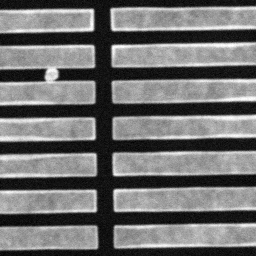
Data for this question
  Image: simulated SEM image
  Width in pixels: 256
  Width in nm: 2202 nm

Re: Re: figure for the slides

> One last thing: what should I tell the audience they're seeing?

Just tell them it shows groups of lines, slits or small figures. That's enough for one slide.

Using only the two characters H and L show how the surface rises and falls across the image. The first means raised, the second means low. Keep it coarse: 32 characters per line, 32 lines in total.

LLLLLLLLLLLLLLLLLLLLLLLLLLLLLLLL
HHLHHHHHHHHLLLHHHHHHHHHHHHHHHHHH
HHHHHHHHHHHLLLHHHHHHHHHHHHHHHHHH
HHHHHHHHHHHLLLHHHHHHHHHHHHHHLLLL
LLLLLLLLLLLLLLLLLLLLLLLLLLLLLLLL
LLLLLLLLLLLLLLLLLLLLLLLLLLLLLLLL
HHHHHHHHHHHHLLHHHHHHHHHHHHHHHHHH
HHHHHHHHHHHHLLHHHHHHHHHHHHHHHHHH
HHLLLLHLLLLLLLLLLLLLLLLLLLLLLLLL
LLLLLLHLLLLLLLLLLLLLLLLLLLLLLLLL
HHHHHHHHHHHHLLHHHHHHHHHHHHHHHHHH
HHHHHHHHHHHHLLHHHHHHHHHHHHHHHHHH
HHHHHHHHHHHHLLHHHHHHHHHHHHHHLLLL
LLLLLLLLLLLLLLLLLLLLLLLLLLLLLLLL
LLLLLLLLLLLLLLLLLLLLLLLLLLLLLLLL
HHHHHHHHHHHHLLHHHHHHHHHHHHHHHHHH
HHHHHHHHHHHHLLHHHHHHHHHHHHHHHHHH
LLLLLLLLLLLLLLLLLLLLLLLLLLLLLLLL
LLLLLLLLLLLLLLLLLLLLLLLLLLLLLLLL
LLLLLLHHHHHHLLHHHHHHHHHHHHHHHHHH
HHHHHHHHHHHHLLHHHHHHHHHHHHHHHHHH
HHHHHHHHHHHHLLHHHHHHHHHHHHHHHHHH
LLLLLLLLLLLLLLLLLLLLLLLLLLLLLLLL
LLLLLLLLLLLLLLLLLLLLLLLLLLLLLLLL
HHHHHHHHHHHHLLHHHHHHHHHHHHHHHHHH
HHHHHHHHHHHHLLHHHHHHHHHHHHHHHHHH
HHHHHHLLLLLLLLLLLLLLLLLLLLLLLLLL
LLLLLLLLLLLLLLLLLLLLLLLLLLLLLLLL
HHHHHHHHHHHHLLLHHHHHHHHHHHHHHHHH
HHHHHHHHHHHHLLHHHHHHHHHHHHHHHHHH
HHHHHHHHHHHHLLHHHHHHHHHHHHHHHHHH
LLLLLLLLLLLLLLLLLLLLLLLLLLLLLLLL